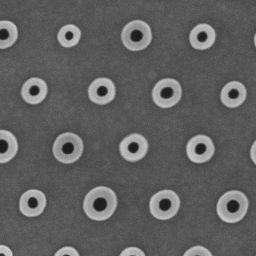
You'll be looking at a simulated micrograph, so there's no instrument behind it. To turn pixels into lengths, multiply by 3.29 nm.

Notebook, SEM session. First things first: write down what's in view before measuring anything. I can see a regular array of ring-shaped raised bodies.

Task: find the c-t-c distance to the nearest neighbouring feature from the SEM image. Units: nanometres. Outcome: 212